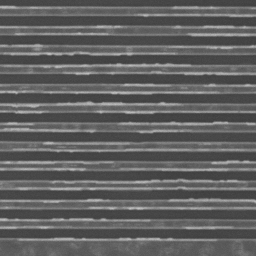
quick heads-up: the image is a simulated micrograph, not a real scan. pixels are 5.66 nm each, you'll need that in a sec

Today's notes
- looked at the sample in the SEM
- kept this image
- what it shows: parallel lines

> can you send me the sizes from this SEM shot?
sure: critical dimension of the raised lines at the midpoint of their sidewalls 54.5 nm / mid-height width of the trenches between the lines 55.2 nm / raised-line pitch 0.109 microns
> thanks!